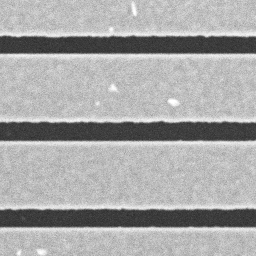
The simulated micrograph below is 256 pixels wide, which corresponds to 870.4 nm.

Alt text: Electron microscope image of lines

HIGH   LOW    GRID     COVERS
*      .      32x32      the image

********************************
********************************
********************************
********************************
..*..****...*..*..............*.
................................
................................
********************************
********************************
********************************
********************************
********************************
********************************
********************************
********************************
................................
................................
................................
********************************
********************************
********************************
********************************
********************************
********************************
********************************
********************************
................................
................................
..........*...*...**...*.****...
********************************
********************************
********************************